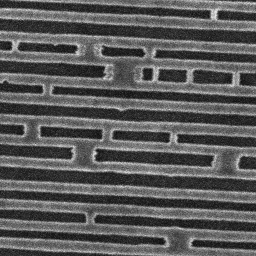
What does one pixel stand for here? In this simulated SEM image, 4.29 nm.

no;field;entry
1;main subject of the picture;parallel lines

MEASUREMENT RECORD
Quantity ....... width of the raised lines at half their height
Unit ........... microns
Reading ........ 0.0407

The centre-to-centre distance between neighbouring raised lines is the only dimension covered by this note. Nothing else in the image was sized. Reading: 89.7 nanometres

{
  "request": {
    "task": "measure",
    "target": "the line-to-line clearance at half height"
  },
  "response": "45 nanometres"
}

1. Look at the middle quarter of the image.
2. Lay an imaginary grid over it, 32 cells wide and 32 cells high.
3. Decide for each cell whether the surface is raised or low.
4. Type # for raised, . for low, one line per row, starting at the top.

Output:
..........######################
..........##########...#......##
...........########............#
#####.....#########...#........#
########################.......#
.###############################
....................############
................................
#########.......................
############################....
..##..##########################
.........................#######
................................
###.............................
##################..............
################################
..........###...################
..........##...............#..##
..........##...............#....
###################.......##....
################################
..######........###.############
..######........................
..######........................
########........................
########################.####...
....############################
.........................#######
................................
................................
###########.....................
##############################..